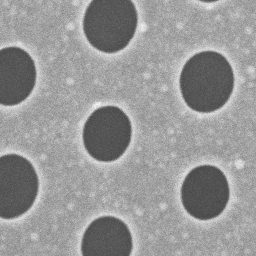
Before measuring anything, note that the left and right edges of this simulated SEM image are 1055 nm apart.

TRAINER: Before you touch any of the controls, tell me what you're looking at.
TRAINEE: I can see holes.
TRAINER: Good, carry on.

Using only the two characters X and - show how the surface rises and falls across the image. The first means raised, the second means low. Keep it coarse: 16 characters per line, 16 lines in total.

XXXXX---XXXXXXXX
XXXXX----XXXXXXX
XXXXXX--XXXXXXXX
--XXXXXXXXXX--XX
--XXXXXXXXX----X
--XXXXXXXXX----X
-XXXXXXXXXXX--XX
XXXXX---XXXXXXXX
XXXXX---XXXXXXXX
XXXXXX--XXXXXXXX
--XXXXXXXXXX--XX
--XXXXXXXXX---XX
--XXXXXXXXX---XX
-XXXXXXXXXXX--XX
XXXXX---XXXXXXXX
XXXXX---XXXXXXXX